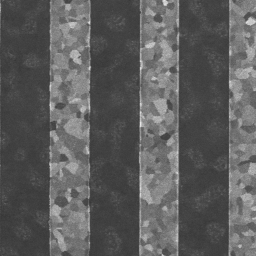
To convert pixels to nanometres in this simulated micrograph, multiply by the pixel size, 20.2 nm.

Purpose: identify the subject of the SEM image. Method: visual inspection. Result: one or a few lines or trenches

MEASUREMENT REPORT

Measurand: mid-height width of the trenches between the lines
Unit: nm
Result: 1030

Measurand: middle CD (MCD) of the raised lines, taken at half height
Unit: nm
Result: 772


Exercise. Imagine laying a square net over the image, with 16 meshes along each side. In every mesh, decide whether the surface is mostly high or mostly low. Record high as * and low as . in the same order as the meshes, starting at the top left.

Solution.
...***...**...**
...***...**...**
...***...**...**
...***...**...**
...***...**...**
...***...**...**
...***...**...**
...***...**...**
...***...**...**
...***...**...**
...***...**...**
...***...**...**
...***...**...**
...***...**...**
...***...**...**
...***...**...**